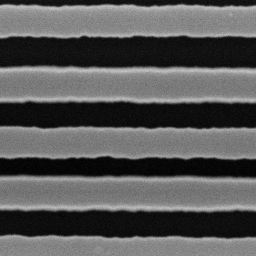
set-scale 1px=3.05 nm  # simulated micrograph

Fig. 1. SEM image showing lines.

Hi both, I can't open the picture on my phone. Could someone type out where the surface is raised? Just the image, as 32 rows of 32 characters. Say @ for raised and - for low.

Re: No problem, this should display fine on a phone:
--------------------------------
@@@@@@@@@@@@@@@@@@@@@@@@@@@@@@@@
@@@@@@@@@@@@@@@@@@@@@@@@@@@@@@@@
@@@@@@@@@@@@@@@@@@@@@@@@@@@@@@@@
@@--@@@@@@-@@@@@@--@@---@@@@--@@
--------------------------------
--------------------------------
--------------------------------
@@@@@@@@@@@@@@--@@@@-@@@@-------
@@@@@@@@@@@@@@@@@@@@@@@@@@@@@@@@
@@@@@@@@@@@@@@@@@@@@@@@@@@@@@@@@
@@@@@@@@@@@@@@@@@@@@@@@@@@@@@@@@
@@@@@@@@@@@@@@@@@@@@@@@@@@@@@@@@
--------------------------------
--------------------------------
--------------------------------
@@@@@@@@@@@@@@@@@@@@@@@@@@@@@@@@
@@@@@@@@@@@@@@@@@@@@@@@@@@@@@@@@
@@@@@@@@@@@@@@@@@@@@@@@@@@@@@@@@
@@@@@@@@@@@@@-@@@@@@@@@@@@@@@@@@
--------------------------------
--------------------------------
@@@@@@@@@@@@@@@@@@@@@@@@@@@@@@@@
@@@@@@@@@@@@@@@@@@@@@@@@@@@@@@@@
@@@@@@@@@@@@@@@@@@@@@@@@@@@@@@@@
@@@@@@@@@@@@@@@@@@@@@@@@@@@@@@@@
--------------------------------
--------------------------------
--------------------------------
@@@---@--@----------------------
@@@@@@@@@@@@@@@@@@@@@@@@@@@@@@@@
@@@@@@@@@@@@@@@@@@@@@@@@@@@@@@@@